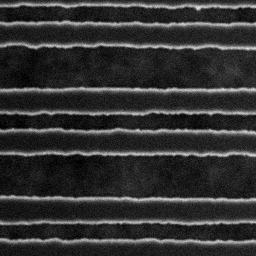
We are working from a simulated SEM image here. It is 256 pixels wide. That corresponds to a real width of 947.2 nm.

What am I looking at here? lines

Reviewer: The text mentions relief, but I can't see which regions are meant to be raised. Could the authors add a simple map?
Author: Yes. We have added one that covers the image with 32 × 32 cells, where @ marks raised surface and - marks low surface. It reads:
@@@@@@@@@@@@@@@@@@@@@@@@@@@@@@@@
--------------------------------
--------------------------------
@@@@@@@@@@@@@@@@@@@@@@@@@@@@@@@@
@@@@@@@@@@@@@@@@@@@@@@@@@@@@@@@@
@@@@@@@@@@@@@@@@@@@@@@@@@@@@@@@@
--------------------------------
--------------------------------
--------------------------------
--------------------------------
--------------------------------
@@@@@@@@@@@@@@@@@@@@@@@@@@@@@@@@
@@@@@@@@@@@@@@@@@@@@@@@@@@@@@@@@
@@@@@@@@@@@@@@@@@@@@@@@@@@@@@@@@
--------------------------------
--------------------------------
@@@@@@@@@@@@@@@@@@@@@@@@@@@@@@@@
@@@@@@@@@@@@@@@@@@@@@@@@@@@@@@@@
@@@@@@@@@@@@@@@@@@@@@@@@@@@@@@@@
--------------------------------
--------------------------------
--------------------------------
--------------------------------
--------------------------------
--------------------------------
@@@@@@@@@@@@@@@@@@@@@@@@@@@@@@@@
@@@@@@@@@@@@@@@@@@@@@@@@@@@@@@@@
@@@@@@@@@@@@@@@@@@@@@@@@@@@@@@@@
--------------------------------
--------------------------------
@@@@@@@@@@@@@@@@@@@@@@@@@@@@@@@@
@@@@@@@@@@@@@@@@@@@@@@@@@@@@@@@@